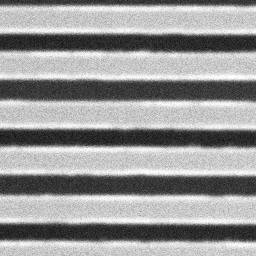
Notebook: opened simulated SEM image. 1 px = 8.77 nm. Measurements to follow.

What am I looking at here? lines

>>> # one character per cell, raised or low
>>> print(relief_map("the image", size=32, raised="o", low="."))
................................
oooooooooooooooooooooooooooooooo
oooooooooooooooooooooooooooooooo
oooooooooooooooooooooooooooooooo
................................
................................
................................
oooooooooooooooooooooooooooooooo
oooooooooooooooooooooooooooooooo
oooooooooooooooooooooooooooooooo
................................
................................
................................
oooooooooooooooooooooooooooooooo
oooooooooooooooooooooooooooooooo
oooooooooooooooooooooooooooooooo
................................
................................
................................
oooooooooooooooooooooooooooooooo
oooooooooooooooooooooooooooooooo
oooooooooooooooooooooooooooooooo
................................
................................
.....o..........................
oooooooooooooooooooooooooooooooo
oooooooooooooooooooooooooooooooo
oooooooooooooooooooooooooooooooo
................................
................................
oooooooooooooooooooooooooooooooo
oooooooooooooooooooooooooooooooo